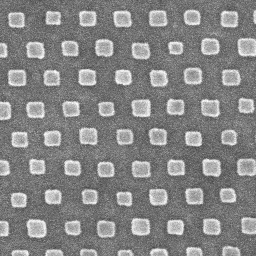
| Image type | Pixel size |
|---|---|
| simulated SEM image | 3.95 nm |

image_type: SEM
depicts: a regular array of raised bodies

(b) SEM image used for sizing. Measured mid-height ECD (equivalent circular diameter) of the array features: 0.0655 micrometres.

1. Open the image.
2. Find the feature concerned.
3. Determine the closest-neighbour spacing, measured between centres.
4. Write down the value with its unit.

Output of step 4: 132 nm